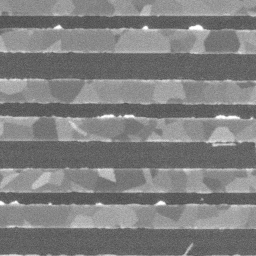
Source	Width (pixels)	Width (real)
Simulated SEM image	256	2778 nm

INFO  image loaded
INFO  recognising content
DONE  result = lines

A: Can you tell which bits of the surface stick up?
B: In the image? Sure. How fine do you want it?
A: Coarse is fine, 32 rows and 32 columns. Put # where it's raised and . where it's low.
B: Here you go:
################################
################################
................................
........................#.......
################################
################################
.###############################
................................
................................
................................
################################
################################
################################
................................
................................
################################
################################
################################
................................
................................
................................
################################
################################
################################
................................
................................
################################
################################
...........................#....
................................
................................
................................